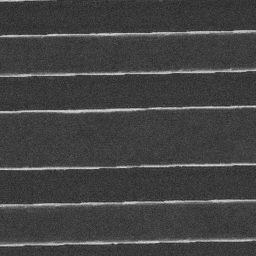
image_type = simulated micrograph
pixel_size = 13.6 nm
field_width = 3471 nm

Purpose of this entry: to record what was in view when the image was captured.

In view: lines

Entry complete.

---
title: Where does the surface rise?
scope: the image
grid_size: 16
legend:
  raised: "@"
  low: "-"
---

----------------
----------------
@@@@@@@@@@@@@@@@
@@@@@@@@@@@@@@@@
@@@@@@@@@@@@@---
----------------
----------------
@@@@@@@@@@@@@@@@
@@@@@@@@@@@@@@@@
@@@@@@@@@@@@@@@@
@@@@@@----------
----------------
----------------
@@@@@@@@@@@@@@@@
@@@@@@@@@@@@@@@@
----------------